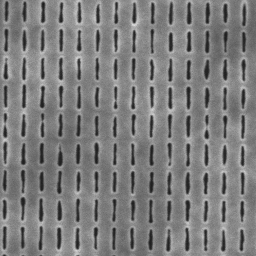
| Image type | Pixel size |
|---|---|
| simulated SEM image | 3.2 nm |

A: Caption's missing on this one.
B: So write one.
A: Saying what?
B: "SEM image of a regular array of holes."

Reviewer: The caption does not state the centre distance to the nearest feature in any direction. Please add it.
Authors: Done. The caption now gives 58.2 nanometers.